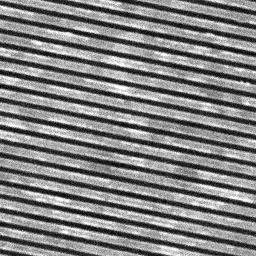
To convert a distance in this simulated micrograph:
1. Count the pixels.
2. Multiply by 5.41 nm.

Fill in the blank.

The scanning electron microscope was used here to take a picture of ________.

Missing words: parallel lines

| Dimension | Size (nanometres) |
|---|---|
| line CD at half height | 41.8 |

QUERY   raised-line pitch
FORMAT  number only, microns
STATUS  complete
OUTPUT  0.0732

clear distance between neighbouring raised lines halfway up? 0.0312 microns